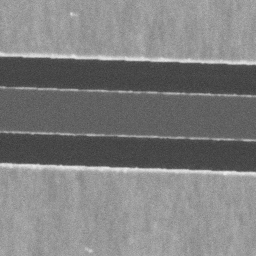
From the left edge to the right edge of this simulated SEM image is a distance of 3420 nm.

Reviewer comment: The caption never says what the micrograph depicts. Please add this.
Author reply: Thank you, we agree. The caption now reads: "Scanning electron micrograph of lines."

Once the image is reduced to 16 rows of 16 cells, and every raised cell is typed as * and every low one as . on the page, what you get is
****************
****************
****************
.***************
................
*...............
****************
****************
.......*********
................
******..........
****************
****************
****************
****************
****************